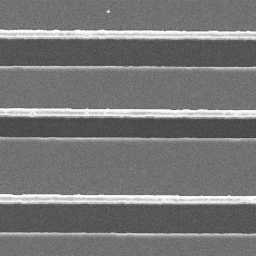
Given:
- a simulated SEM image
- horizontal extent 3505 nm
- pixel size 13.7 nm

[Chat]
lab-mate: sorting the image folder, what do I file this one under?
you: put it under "lines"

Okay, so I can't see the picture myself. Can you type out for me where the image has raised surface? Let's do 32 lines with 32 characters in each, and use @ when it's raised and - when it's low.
@@@@@@@@@@@@@@@@@@@@@@@@@@@@@@@@
@@@@@@@@@@@@@@@@@@@@@@@@@@@@@@@@
@@@@@@@@@@@@@@@@@@@@@@@@@@@@@@@@
@@@@@@@@@@@@@@@@@@@@@@@@@@@@@@@@
@@@@@@@@@@@@@@@@@@@@@@@@@@@@@@@@
--------------------------------
--------------------------------
--------------------------------
@@@@@@@@@@@@@@@@@@@@@@@@@@@@@@-@
@@@@@@@@@@@@@@@@@@@@@@@@@@@@@@@@
@@@@@@@@@@@@@@@@@@@@@@@@@@@@@@@@
@@@@@@@@@@@@@@@@@@@@@@@@@@@@@@@@
@@@@@@@@@@@@@@@@@@@@@@@@@@@@@@@@
@@@@@@@@@@@@@@@@@@@@@@@@@@@@@@@@
---@@----------@@@@@@@@@@@@@@@@@
--------------------------------
--------------------------------
@@@@@@@@@@@@@@@@@@@@@@@@@@@@@@@@
@@@@@@@@@@@@@@@@@@@@@@@@@@@@@@@@
@@@@@@@@@@@@@@@@@@@@@@@@@@@@@@@@
@@@@@@@@@@@@@@@@@@@@@@@@@@@@@@@@
@@@@@@@@@@@@@@@@@@@@@@@@@@@@@@@@
@@@@@@@@@@@@@@@@@@@@@@@@@@@@@@@@
@@@@@@@@@@@@@@@@@@@@@@@@@@@@@@@@
@@@@@@@@@@@@@@@@@@@@@@@@@@@@@@@@
--------------------------------
--------------------------------
--------------------------------
--------------------------------
@@@@@@@@@@@@@@@@@@@@@@@@@@@@@@@@
@@@@@@@@@@@@@@@@@@@@@@@@@@@@@@@@
@@@@@@@@@@@@@@@@@@@@@@@@@@@@@@@@